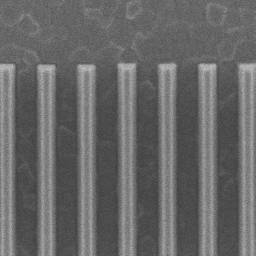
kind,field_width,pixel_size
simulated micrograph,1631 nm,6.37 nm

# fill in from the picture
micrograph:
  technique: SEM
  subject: parallel lines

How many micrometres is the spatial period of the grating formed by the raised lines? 0.256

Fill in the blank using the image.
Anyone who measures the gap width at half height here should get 26.8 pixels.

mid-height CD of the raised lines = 85.2 nanometers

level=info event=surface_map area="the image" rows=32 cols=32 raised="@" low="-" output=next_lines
--------------------------------
--------------------------------
--------------------------------
--------------------------------
--------------------------------
--------------------------------
--------------------------------
--------------------------------
@----@----@----@@---@@---@@---@@
@@---@@---@@---@@---@@---@@---@@
@@---@@---@@---@@---@@---@@---@@
@----@@---@@---@@---@@---@@---@@
@----@@---@@---@@---@@---@@---@@
@@---@@---@@---@@---@@---@@---@@
@@---@@---@@---@@---@@---@@---@@
@@---@@---@@---@@---@@---@@---@@
@@---@@---@@---@@---@@---@@---@@
@@---@@---@@---@@---@@---@@---@@
@@---@@---@@---@@---@@---@@---@@
@@---@@---@@---@@---@@---@@---@@
@@---@@---@@---@@---@@---@@---@@
@@---@@---@@---@@---@@---@@---@@
@@---@@---@@---@@---@@---@@---@@
@@---@@---@@---@@---@@---@@---@@
@@---@@---@@---@@---@@---@@---@@
@@---@@---@@---@@---@@---@@---@@
@@---@@---@@---@@---@@---@@---@@
@@---@@---@@---@@---@@---@@---@@
@@---@@---@@---@@---@@---@@---@@
@@---@@---@@---@@---@@---@@---@@
@@---@@---@@---@@---@@---@@---@@
@@---@@---@@---@@---@@---@@---@@